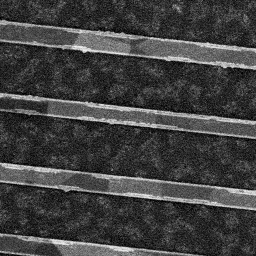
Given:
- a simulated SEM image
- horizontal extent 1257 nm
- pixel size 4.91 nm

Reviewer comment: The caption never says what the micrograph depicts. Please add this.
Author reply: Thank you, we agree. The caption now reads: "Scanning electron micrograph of one or a few lines or trenches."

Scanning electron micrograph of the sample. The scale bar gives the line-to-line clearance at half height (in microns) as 0.256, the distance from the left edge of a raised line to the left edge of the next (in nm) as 346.